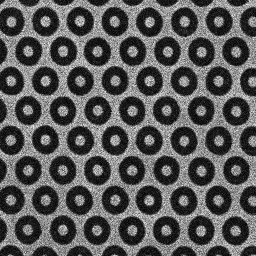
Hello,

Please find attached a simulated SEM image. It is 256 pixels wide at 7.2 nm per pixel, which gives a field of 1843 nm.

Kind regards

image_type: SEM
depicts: a regular array of ring-shaped grooves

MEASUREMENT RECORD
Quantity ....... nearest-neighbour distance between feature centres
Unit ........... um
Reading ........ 0.244